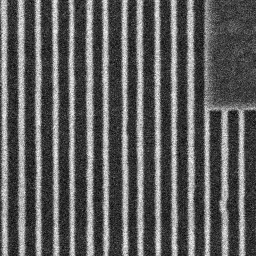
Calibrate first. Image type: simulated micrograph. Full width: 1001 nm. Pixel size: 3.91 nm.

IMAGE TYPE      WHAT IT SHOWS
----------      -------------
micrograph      parallel lines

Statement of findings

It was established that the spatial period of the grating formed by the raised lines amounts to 66.2 nanometres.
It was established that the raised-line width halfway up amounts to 19 nanometres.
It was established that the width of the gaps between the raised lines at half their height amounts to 45.4 nm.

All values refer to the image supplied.